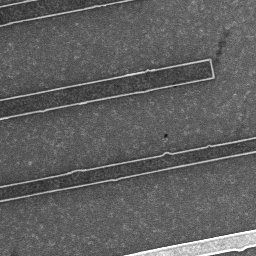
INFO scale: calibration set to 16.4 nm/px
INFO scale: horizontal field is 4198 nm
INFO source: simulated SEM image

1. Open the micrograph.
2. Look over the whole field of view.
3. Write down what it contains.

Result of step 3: one or a few lines or trenches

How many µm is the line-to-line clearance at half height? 1.2